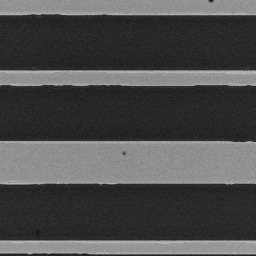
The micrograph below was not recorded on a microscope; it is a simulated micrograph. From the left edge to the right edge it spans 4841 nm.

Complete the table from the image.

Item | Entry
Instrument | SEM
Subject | lines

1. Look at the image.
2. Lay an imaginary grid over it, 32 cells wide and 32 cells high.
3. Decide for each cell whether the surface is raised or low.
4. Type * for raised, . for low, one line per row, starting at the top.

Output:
********************************
********************************
................................
................................
................................
................................
................................
................................
................................
********************************
********************************
................................
................................
................................
................................
................................
................................
................................
********************************
********************************
********************************
********************************
********************************
................................
................................
................................
................................
................................
................................
................................
********************************
********************************